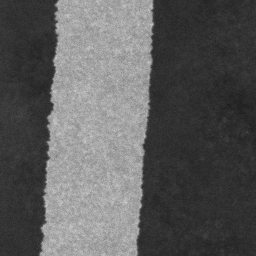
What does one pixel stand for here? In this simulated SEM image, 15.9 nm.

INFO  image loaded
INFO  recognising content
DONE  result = one or a few lines or trenches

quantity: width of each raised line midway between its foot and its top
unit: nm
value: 1490